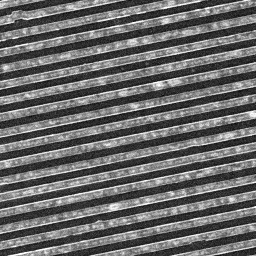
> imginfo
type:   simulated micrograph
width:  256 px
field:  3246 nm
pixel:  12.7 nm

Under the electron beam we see parallel lines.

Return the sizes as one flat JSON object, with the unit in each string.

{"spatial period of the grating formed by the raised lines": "200 nanometres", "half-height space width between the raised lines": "103 nm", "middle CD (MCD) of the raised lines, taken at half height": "90.2 nanometers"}